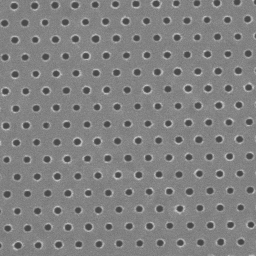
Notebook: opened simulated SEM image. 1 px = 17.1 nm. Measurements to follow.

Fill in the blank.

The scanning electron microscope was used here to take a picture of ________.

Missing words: a regular array of holes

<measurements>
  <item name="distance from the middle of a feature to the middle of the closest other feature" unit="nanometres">336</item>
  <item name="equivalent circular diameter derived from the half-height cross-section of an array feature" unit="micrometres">0.122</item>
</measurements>